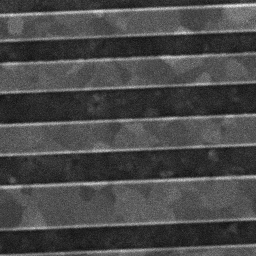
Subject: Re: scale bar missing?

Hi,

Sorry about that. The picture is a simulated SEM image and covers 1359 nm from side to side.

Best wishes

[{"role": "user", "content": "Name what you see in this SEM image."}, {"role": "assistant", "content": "one or a few lines or trenches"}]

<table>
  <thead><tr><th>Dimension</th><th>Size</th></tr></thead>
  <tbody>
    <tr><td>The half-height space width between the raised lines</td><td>0.153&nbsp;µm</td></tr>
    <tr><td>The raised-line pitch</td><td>319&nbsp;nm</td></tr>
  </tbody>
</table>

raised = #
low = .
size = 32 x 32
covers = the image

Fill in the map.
................................
............####################
################################
################################
###############.................
................................
................................
.............###################
################################
################################
########################........
................................
................................
................................
..............................##
......##########################
################################
################################
###################.............
................................
................................
................................
......................##########
################################
################################
################################
################################
###########################.....
####............................
................................
................................
.............###################